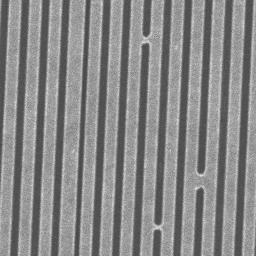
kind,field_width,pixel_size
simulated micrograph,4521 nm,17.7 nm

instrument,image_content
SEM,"parallel lines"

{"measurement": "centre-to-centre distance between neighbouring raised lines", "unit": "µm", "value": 0.359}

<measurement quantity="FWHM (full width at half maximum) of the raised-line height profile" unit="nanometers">232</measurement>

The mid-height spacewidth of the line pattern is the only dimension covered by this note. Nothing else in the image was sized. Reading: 123 nanometres